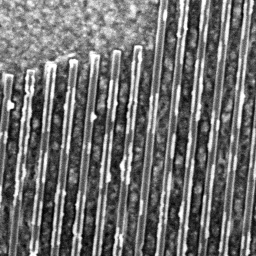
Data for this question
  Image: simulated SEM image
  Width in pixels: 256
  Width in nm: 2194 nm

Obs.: parallel lines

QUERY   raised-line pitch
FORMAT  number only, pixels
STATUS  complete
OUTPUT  21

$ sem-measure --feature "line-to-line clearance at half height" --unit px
13.4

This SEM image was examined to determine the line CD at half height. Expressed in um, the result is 0.065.